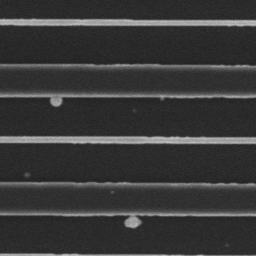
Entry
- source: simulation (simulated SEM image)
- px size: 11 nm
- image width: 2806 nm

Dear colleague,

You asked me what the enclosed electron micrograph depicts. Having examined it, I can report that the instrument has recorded lines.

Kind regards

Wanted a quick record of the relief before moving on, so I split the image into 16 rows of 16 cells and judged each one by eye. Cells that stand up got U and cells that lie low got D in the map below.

DDDDDDDDDDDDDDDD
DDDDDDDDDDDDDDDD
DDDDDDDDDDDDDDDD
DDDDDDDDDDDDDDDD
UUUUUUUUUUUUUUUU
UUUUUUUUUUUUUUUU
DDDDDDDDDDDDDDDD
DDDDDDDDDDDDDDDD
DDDDDDDDDDDDDDDD
DDDDDDDDDDDDDDDD
DDDDDDDDDDDDDDDD
UUUUUUUUUUUUUUUU
UUUUUUUUUUUUUUUU
DDDDDDDDUDDDDDDD
DDDDDDDDDDDDDDDD
DDDDDDDDDDDDDDDD